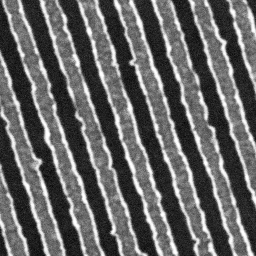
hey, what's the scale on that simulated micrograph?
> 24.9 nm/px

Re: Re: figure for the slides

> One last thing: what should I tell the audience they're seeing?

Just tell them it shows parallel lines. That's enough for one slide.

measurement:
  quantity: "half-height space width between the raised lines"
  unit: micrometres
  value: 0.451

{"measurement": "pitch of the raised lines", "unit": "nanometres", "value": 885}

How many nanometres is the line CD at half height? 424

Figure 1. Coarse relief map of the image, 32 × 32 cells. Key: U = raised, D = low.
UUUDDUUDDDUUDDDUUDDUUUDDUUDDDUUD
DUUDDDUUDDUUDDDUUDDDUUDDUUDDDUUD
DUUDDDUUDDDUUDDUUDDDUUDDUUUDDUUU
DUUUDDUUDDDUUDDDUUDDUUDDDUUDDDUU
DDUUDDDUUDDUUDDDUUDDDUUDDUUDDDUU
DDUUDDDUUDDDUUDDUUDDDUUDDDUUDDUU
DDDUUDDUUDDDUUDDDUUDDUUDDDUUDDUU
DDDUUDDUUUDDUUDDDUUDDUUUDDUUUDDU
UDDUUDDDUUDDUUUDDUUDDDUUDDUUUDDU
UDDDUUDDUUDDDUUDDUUUDDUUUDDUUDDU
UDDDUUDDDUUDDUUDDDUUDDDUUDDUUDDD
UUDDUUDDDUUDDUUUDDUUDDDUUDDUUUDD
UUDDUUUDDUUDDDUUDDUUUDDUUDDDUUDD
UUDDDUUDDDUUDDUUDDDUUDDUUUDDUUDD
UUUDDUUDDDUUDDUUUDDUUDDDUUDDUUDD
DUUDDUUDDDUUDDDUUDDUUUDDUUDDDUUD
DUUDDDUUDDUUUDDUUDDDUUDDUUUDDUUD
DUUDDDUUDDDUUDDUUDDDUUDDDUUDDUUU
DDUUDDUUDDDUUDDDUUDDUUDDDUUDDDUU
DDUUDDDUUDDUUUDDUUDDDUUDDUUUDDUU
DDUUUDDUUDDDUUDDUUUDDUUDDDUUDDUU
DDDUUDDUUUDDUUDDDUUDDUUUDDUUDDDU
DDDUUDDDUUDDUUUDDUUDDDUUDDDUDDDU
UDDUUUDDUUDDDUUDDUUDDDUUDDDUUDDU
UDDDUUDDUUUDDUUDDDUUDDUUUDDUUDDD
UUDDUUDDDUUDDUUDDDUUDDDUUDDUUDDD
UUDDUUDDDUUDDDUUDDUUDDDUUDDDUUDD
UUDDDUUDDUUUDDUUDDDUUDDUUDDDUUDD
UUDDDUUDDDUUDDUUDDDUUDDDUUDDUUDD
DUUDDUUDDDUUDDUUUDDUUDDDUUDDDUUD
DUUDDDUUDDUUDDDUUDDDUUDDDUDDDUUD
DUUDDDUUDDUUUDDUUUDDUUDDDUUDDUUD